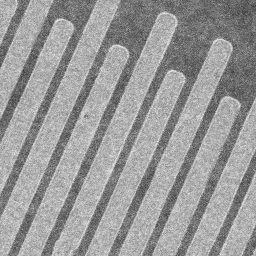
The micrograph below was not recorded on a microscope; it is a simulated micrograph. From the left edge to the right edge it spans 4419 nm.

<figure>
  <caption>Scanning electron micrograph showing parallel lines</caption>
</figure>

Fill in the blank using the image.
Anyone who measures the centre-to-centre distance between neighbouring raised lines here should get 524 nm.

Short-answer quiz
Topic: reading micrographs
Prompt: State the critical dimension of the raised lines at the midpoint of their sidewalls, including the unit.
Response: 337 nm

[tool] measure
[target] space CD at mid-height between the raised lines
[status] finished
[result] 195 nm